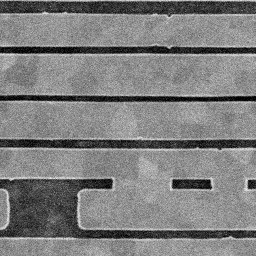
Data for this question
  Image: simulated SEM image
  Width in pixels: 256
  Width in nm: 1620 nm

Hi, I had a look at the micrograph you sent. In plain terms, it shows parallel lines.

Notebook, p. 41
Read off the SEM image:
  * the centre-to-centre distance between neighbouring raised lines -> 283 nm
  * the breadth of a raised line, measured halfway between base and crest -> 234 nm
